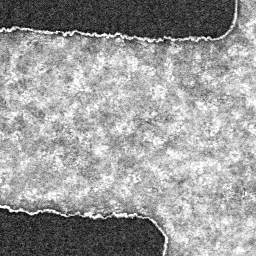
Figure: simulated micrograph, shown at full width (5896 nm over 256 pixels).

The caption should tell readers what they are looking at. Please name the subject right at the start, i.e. one or a few lines or trenches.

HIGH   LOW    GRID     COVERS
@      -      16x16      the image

@@@@@@@@@@@@@@@-
@@@@@@@@@@@@@@@-
---------@------
----------------
----------------
----------------
----------------
----------------
----------------
----------------
----------------
----------------
----------------
@@@@@@-@@-------
@@@@@@@@@@------
@@@@@@@@@@------